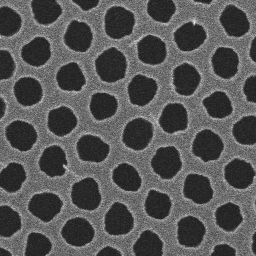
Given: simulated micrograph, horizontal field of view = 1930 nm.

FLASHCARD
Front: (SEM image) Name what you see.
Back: a regular array of holes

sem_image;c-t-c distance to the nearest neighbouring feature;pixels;41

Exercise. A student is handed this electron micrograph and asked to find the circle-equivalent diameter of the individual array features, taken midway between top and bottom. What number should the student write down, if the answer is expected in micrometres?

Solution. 0.224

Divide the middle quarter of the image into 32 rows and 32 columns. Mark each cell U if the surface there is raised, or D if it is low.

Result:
DDDDUUUUDDDDDDDDUUUUUUUUUUUUUDDD
DDDDUUUUDDDDDDDUUUUUUUUUUUUUDDDD
DDDDDUUUDDDDDDDUUUUUUUUUUUUDDDDD
DDDDDUUUUDDDDDDUUDDDDDUUUUUUDDDD
DDDDDDUUUUDDUUUUUDDDDDDUUUUDDDDD
DDDDDUUUUUUUUUUUDDDDDDDUUUUUDDDD
DDDDUUUUUUUUUUUUDDDDDDDUUUUUDDDD
UUUUUUUUDDDUUUUUDDDDDDDUUUUUUDDD
UUUUUUUDDDDDDUUUDDDDDDUUUUUUUUUU
UUUUUUUDDDDDDUUUUDDDDUUUUUUUUUUU
UUUUUUDDDDDDDUUUUUUDUUUUUDDDDDUU
DDUUUUDDDDDDDUUUUUUUUUUUUDDDDDDU
DDUUUUUDDDDDDUUUUUUUUUUUDDDDDDDU
DDDUUUUDDDDUUUUUUUDUUUUUDDDDDDDU
DDDUUUUUUUUUUUUUDDDDDUUUDDDDDDDU
DDDUUUUUUUUUUUUDDDDDDDUUDDDDDDDU
DDUUUUUUUUUUUUUDDDDDDDUUUDDDDDUU
DUUUUUUUUUUUUUUDDDDDDDUUUUUUUUUU
UUUUDDDDDUUUUUUDDDDDDDUUUUUUUUUU
UUUDDDDDDDUUUUUDDDDDDUUUUUUUUUUU
UUUDDDDDDDDUUUUUDDDDDUUUUUUUUUUU
UUUDDDDDDDDUUUUUUUDUUUUDDDDDUUUU
UUUUDDDDDDDUUUUUUUUUUUUDDDDDDUUU
UUUUDDDDDDUUUUUUUUUUUUDDDDDDDUUU
DUUUUUUDDUUUUUUUUUUUUUDDDDDDDUUU
UUUUUUUUUUUUUDDDDUUUUUDDDDDDDUUU
UUUUUUUUUUUUUDDDDDUUUUDDDDDDDUUU
UUUUUUUUUUUUDDDDDDDUUUUDDDDDUUUD
UUUUUDDUUUUUDDDDDDDUUUUUDDDUUUDD
UUUDDDDDUUUUDDDDDDDUUUUUUUUUUUDD
UUDDDDDDDUUUUDDDDDDUUUUUUUUUUUDD
UUDDDDDDDUUUUUUDDDUUUUDUUUUUUUDD